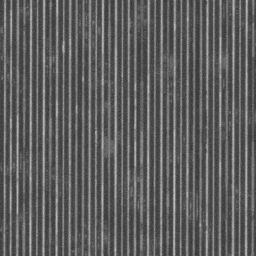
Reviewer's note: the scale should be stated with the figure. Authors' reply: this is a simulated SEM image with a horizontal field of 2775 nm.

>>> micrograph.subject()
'parallel lines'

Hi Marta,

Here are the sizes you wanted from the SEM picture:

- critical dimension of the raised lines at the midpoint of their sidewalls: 19 nm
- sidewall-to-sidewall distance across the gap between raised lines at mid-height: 58.3 nm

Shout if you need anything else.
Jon